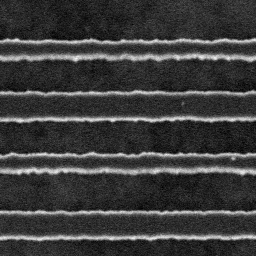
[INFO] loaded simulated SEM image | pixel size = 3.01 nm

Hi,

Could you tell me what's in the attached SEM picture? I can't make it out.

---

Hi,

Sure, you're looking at lines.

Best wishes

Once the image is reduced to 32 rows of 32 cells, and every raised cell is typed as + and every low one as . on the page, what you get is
................................
................................
................................
................................
................................
++++++++++++++++++++++++++++++++
++++++++++++++++++++++++++++++++
...............................+
................................
................................
................................
.................+......+......+
++++++++++++++++++++++++++++++++
++++++++++++++++++++++++++++++++
++++++++++++++++++++++++++++++++
................................
................................
................................
................................
++++++++++++++++++++++++++++++++
++++++++++++++++++++++++++++++++
.++...+....+...++.............++
................................
................................
................................
................................
++++++.+.+++++++++++++++++++++++
++++++++++++++++++++++++++++++++
++++++++++++++++++++++++++++++++
++++++++++++++++++++++++++++++++
................................
................................